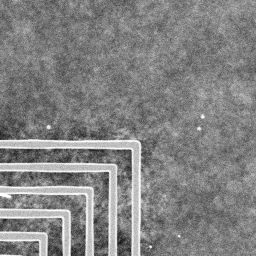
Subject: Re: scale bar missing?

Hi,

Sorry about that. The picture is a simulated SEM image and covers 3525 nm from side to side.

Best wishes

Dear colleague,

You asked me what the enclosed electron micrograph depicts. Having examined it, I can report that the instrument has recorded groups of lines, slits or small figures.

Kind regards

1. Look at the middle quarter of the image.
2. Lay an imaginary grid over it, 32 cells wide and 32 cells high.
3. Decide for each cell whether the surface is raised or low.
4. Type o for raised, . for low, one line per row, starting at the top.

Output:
................................
................................
................................
................................
................................
................................
................................
................................
................................
................................
................................
................................
................................
................................
................................
................................
................................
................................
................................
ooooooooooooooooooo.............
ooooooooooooooooooo.............
.................oo.............
.................oo.............
.................oo.............
.................oo.............
ooooooooooooo....oo.............
ooooooooooooo....oo.............
...........oo....oo.............
...........oo....oo.............
...........oo....oo.............
...........oo....oo.............
ooooooo....oo....oo.............